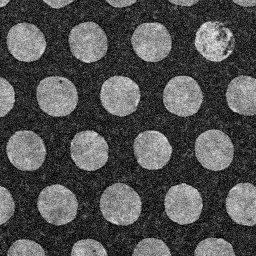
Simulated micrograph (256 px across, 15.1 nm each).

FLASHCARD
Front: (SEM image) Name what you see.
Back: a regular array of raised bodies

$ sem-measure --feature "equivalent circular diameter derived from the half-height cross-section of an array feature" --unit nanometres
588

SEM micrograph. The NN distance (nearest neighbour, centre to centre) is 62.1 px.